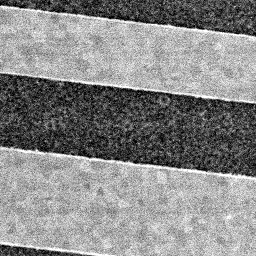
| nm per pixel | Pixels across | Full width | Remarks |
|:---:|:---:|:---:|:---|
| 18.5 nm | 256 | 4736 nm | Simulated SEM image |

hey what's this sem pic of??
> one or a few lines or trenches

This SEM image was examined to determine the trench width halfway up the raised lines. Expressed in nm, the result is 1400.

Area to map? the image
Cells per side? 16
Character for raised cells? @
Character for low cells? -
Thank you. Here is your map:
@---------------
@@@@@@@@@-------
@@@@@@@@@@@@@@@@
@@@@@@@@@@@@@@@@
@@@@@@@@@@@@@@@@
--------@@@@@@@@
----------------
----------------
----------------
@@--------------
@@@@@@@@@@------
@@@@@@@@@@@@@@@@
@@@@@@@@@@@@@@@@
@@@@@@@@@@@@@@@@
@@@@@@@@@@@@@@@@
---@@@@@@@@@@@@@